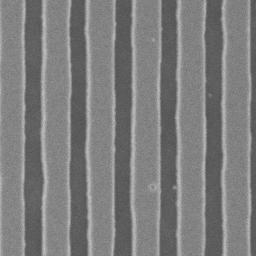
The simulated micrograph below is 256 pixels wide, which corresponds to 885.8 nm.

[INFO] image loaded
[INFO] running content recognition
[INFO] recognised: lines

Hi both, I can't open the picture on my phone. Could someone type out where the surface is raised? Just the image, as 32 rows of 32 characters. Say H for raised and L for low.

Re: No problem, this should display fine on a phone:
HHHLLHHHHLLHHHLLLHHHLLHHHHLLHHHL
HHHLLHHHHLLHHHLLLHHHLLHHHHLLHHHL
HHHLLHHHHLLHHHLLLHHHLLHHHHLLHHHL
HHHLLHHHHLLHHHLLHHHHLLHHHHLLHHHL
HHHLLHHHHLLHHHLLHHHHLLHHHLLLHHHL
HHHLLHHHHLLHHHLLLHHHLLHHHHLLHHHL
HHHLLHHHHLLHHHLLLHHHLLHHHHLLHHHL
HHHLLHHHHLLHHHLLLHHHLLHHHHLLHHHL
HHHLLHHHHLLHHHLLLHHHLLHHHHLLHHHL
HHHLLHHHHLLHHHLLLHHHLLHHHHLLHHHL
HHHLLHHHHLLHHHLLLHHHLLHHHHLLHHHL
HHHLLHHHHLLHHHLLLHHHLLHHHHLLHHHL
HHHLLHHHHLLHHHLLLHHHLLHHHHLLHHHL
HHHLLHHHHLLHHHLLLHHHLLHHHHLLHHHL
HHHLLHHHHLLHHHLLLHHHLLHHHHLLHHHL
HHHLLHHHHLLHHHLLLHHHLLHHHHLLHHHL
HHHLLHHHHLLHHHLLHHHHLLHHHHLLHHHL
HHHLLHHHHLLHHHLLHHHHLLHHHHLLHHHL
HHHLLHHHHLLHHHLLLHHHLLHHHHLLHHHL
HHHLLHHHHLLHHHLLHHHHLLHHHHLLHHHL
HHHLLHHHHLLHHHLLHHHHLLHHHHLLHHHL
HHHLLHHHHLLHHHLLHHHHLLHHHHLLHHHL
HHHLLLHHHLLHHHLLHHHHLLHHHHLLHHHL
HHHLLLHHHLLHHHLLHHHHLLHHHHLLHHHL
HHHLLHHHHLLHHHLLHHHHLLHHHHLLHHHL
HHHLLHHHHLLHHHLLHHHHLLHHHHLLHHHL
HHHLLHHHHLLHHHLLHHHHLLHHHHLLHHHL
HHHLLHHHHLLHHHLLLHHHLLHHHHLLHHHL
HHHLLHHHHLLHHHLLLHHHLLHHHHLLHHHL
HHHLLHHHHLLHHHLLLHHHLLHHHHLLHHHL
HHHLLHHHHLLHHHLLLHHHLLHHHHLLHHHL
HHHLLHHHHLLHHHLLLHHHLLHHHHLLHHHL